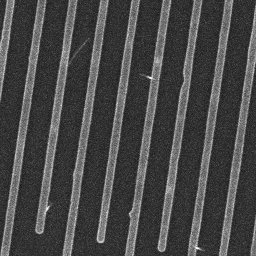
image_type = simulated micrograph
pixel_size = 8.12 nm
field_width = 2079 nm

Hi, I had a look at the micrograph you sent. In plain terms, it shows parallel lines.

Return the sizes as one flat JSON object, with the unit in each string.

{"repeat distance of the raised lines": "0.251 µm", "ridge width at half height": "62.3 nm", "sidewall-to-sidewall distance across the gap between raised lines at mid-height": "0.187 µm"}